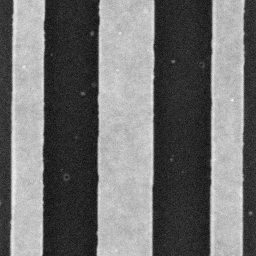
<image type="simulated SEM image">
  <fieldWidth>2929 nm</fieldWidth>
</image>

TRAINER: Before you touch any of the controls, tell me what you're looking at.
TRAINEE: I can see lines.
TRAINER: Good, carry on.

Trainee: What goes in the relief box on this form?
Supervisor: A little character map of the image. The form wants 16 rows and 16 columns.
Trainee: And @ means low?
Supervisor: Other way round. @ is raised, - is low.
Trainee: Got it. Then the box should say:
-@@---@@@@---@@-
-@@---@@@@---@@-
-@@---@@@@---@@-
-@@---@@@@---@@-
-@@---@@@@---@@-
-@@---@@@@---@@-
-@@---@@@@---@@-
-@@---@@@@---@@-
-@@---@@@@---@@-
-@@---@@@@---@@-
-@@---@@@@---@@-
-@@---@@@@---@@-
-@@---@@@----@@-
-@@---@@@----@@-
-@@---@@@----@@-
-@@---@@@----@@-